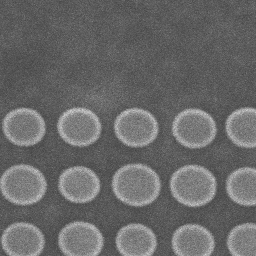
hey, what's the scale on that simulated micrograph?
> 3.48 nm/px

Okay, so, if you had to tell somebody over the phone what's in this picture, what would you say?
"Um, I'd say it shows a regular array of raised bodies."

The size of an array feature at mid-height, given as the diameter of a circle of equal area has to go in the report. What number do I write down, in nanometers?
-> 133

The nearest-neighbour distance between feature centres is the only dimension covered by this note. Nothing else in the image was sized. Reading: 56.8 pixels